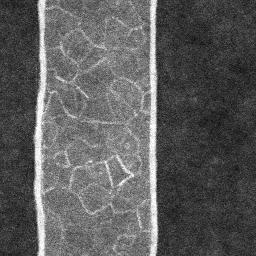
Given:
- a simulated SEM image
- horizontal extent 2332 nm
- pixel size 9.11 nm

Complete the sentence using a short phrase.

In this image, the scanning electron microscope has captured one or a few lines or trenches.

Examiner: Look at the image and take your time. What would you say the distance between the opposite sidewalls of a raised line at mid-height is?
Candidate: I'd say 1.03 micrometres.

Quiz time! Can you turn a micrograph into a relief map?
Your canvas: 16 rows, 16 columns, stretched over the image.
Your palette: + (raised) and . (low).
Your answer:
...+++++++......
...+++++++......
...+++++++......
...+++++++......
...+++++++......
...+++++++......
...+++++++......
..++++++++......
..++++++++......
..++++++++......
..++++++++......
..++++++++......
..++++++++......
..++++++++......
...+++++++......
...+++++++......